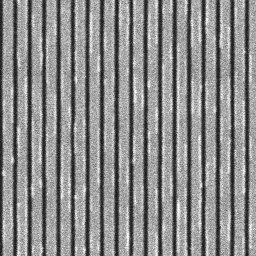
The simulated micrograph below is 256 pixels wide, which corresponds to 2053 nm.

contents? parallel lines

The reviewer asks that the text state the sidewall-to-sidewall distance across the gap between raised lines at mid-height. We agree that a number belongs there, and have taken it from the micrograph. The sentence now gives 37.1 nm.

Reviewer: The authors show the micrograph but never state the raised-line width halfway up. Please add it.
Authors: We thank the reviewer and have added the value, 0.0751 um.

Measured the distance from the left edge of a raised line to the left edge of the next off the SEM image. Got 0.116 um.